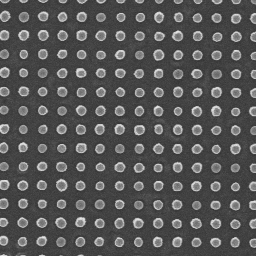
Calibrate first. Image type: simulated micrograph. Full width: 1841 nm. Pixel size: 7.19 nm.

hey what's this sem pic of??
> a regular array of raised bodies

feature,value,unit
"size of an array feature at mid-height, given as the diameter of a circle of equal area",70.7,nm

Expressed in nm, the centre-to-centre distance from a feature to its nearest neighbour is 132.